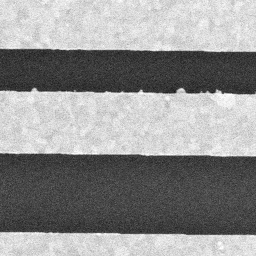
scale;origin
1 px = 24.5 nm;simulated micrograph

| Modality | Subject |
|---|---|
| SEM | lines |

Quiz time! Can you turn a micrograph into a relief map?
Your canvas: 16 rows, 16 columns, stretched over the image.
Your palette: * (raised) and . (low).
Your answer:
****************
****************
****************
................
................
................
****************
****************
****************
****************
................
................
................
................
................
****************